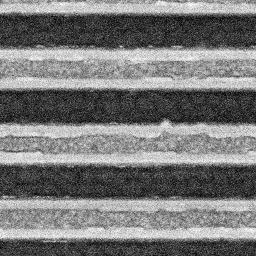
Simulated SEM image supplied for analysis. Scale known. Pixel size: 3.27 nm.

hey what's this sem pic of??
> one or a few lines or trenches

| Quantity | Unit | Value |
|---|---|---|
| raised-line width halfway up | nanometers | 99.2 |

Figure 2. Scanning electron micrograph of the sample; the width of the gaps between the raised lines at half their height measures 146 nanometres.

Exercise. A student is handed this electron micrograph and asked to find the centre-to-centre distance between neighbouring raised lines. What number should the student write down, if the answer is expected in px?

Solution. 74.9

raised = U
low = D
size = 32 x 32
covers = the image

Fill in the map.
UUUUUUUUUUUUUUUUUUUUUUUUUUUUUUUU
DDDDDDDDDDDDDDDDDDDDDDDDDDDDDDDD
DDDDDDDDDDDDDDDDDDDDDDDDDDDDDDDD
DDDDDDDDDDDDDDDDDDDDDDDDDDDDDDDD
DDDDDDDDDDDDDDDDDDDDDDDDDDDDDDDD
DDDDDDDDDDDDDDDDDDDDDDDDDDDDDDDD
DDDDDDDDDDDDDDDDDDDDDDDDDDDDDDDD
UUUUUUUUUUUUUUUUUUUUUUUUUUUUUUUU
UUUUUUUUUUUUUUUUUUUUUUUUUUUUUUUU
UUUUUUUUUUUUUUUUUUUUUUUUUUUUUUUU
DDDDDDDDDDDDDDDDUUDDDDDDDDDDDDDD
DDDDDDDDDDDDDDDDDDDDDDDDDDDDDDDD
DDDDDDDDDDDDDDDDDDDDDDDDDDDDDDDD
DDDDDDDDDDDDDDDDDDDDDDDDDDDDDDDD
DDDDDDDDDDDDDDDDDDDDDDDDDDDDDDDD
DDDDDDDDDDDDDDDDDDDDDDDDDDDDDDDD
UUUUUUUUUUUUUUUUUUUUUUUUUUUUUUUU
UUUUUUUUUUUUUUUUUUUUUUUUUUUUUUUU
UUUUUUUUUUUUUUUUUUUUUUUUUUUUUUUU
UUUUUUUUUUUUUUUUUUUUUUUUUUUUUUUU
DDDDDDDDDDDDDDDDDDDDDDDDDDDDDDDD
DDDDDDDDDDDDDDDDDDDDDDDDDDDDDDDD
DDDDDDDDDDDDDDDDDDDDDDDDDDDDDDDD
DDDDDDDDDDDDDDDDDDDDDDDDDDDDDDDD
DDDDDDDDDDDDDDDDDDDDDDDDDDDDDDDD
DDDDDDDDDDDDDDDDDDDDDDDDDDDDDDDD
UUUUUUUUUUUUUUUUUUUUUUUUUUUUUUUU
UUUUUUUUUUUUUUUUUUUUUUUUUUUUUUUU
UUUUUUUUUUUUUUUUUUUUUUUUUUUUUUUU
DDDDDDDDDDDDDDDDDDDDDDDDDDDDDDDD
DDDDDDDDDDDDDDDDDDDDDDDDDDDDDDDD
DDDDDDDDDDDDDDDDDDDDDDDDDDDDDDDD